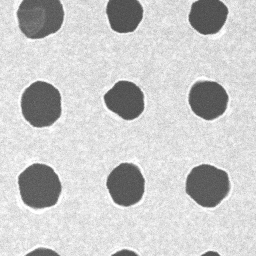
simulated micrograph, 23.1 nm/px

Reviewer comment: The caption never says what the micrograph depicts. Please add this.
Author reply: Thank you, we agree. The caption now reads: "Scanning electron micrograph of holes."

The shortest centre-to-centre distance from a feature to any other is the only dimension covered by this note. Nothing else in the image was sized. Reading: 1.89 µm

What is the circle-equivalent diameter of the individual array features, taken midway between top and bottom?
987 nanometers